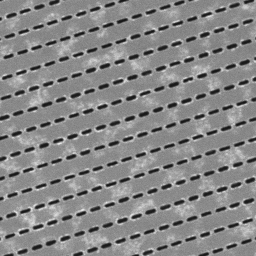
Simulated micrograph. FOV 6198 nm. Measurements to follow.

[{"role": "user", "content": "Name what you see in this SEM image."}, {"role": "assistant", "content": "a regular array of holes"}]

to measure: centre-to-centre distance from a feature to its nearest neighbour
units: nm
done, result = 357